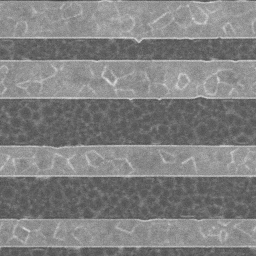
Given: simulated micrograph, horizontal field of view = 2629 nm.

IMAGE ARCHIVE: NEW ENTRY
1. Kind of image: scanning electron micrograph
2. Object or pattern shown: one or a few lines or trenches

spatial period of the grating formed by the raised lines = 0.73 um